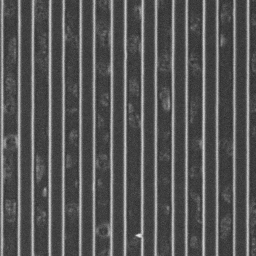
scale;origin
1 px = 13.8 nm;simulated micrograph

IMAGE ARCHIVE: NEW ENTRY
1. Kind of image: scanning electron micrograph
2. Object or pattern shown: parallel lines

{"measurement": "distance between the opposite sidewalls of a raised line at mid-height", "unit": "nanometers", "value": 202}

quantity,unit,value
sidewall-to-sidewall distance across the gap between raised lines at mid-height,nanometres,228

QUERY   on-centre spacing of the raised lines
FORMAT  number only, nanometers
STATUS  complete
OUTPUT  424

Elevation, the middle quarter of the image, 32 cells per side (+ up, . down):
....+++.....+++.....+++....++++.
....+++.....+++.....+++....++++.
....+++.....+++.....+++....++++.
....+++.....+++.....+++....++++.
....+++.....+++.....+++....++++.
....+++.....+++.....+++....++++.
....+++.....+++.....+++....++++.
....+++.....+++.....+++....++++.
....+++.....+++.....+++....++++.
....+++.....+++.....+++....++++.
....+++.....+++.....+++....++++.
....+++.....+++.....+++....++++.
....+++.....+++.....+++....++++.
....+++.....+++.....+++....++++.
....+++.....+++.....+++....++++.
....+++.....+++.....+++....++++.
....+++.....+++.....+++....++++.
....+++.....+++.....+++....++++.
....+++.....+++.....+++....++++.
....+++.....+++.....+++....++++.
....+++.....+++.....+++....++++.
....+++.....+++.....+++....++++.
....+++.....+++.....+++....++++.
....+++.....+++.....+++....++++.
....+++.....+++.....+++....++++.
....+++.....+++.....+++....++++.
....+++.....+++.....+++....++++.
....+++.....+++.....+++....++++.
....+++.....+++.....+++....++++.
....+++.....+++.....+++....++++.
....+++.....+++.....+++....++++.
....+++.....+++.....+++....++++.